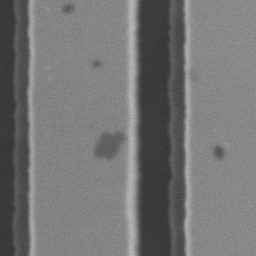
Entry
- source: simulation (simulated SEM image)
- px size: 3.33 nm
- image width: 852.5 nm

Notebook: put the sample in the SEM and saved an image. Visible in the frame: lines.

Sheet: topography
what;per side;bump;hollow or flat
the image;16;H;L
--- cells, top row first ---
LLHHHHHHHLLLHHHH
LLHHHHHHHLLLHHHH
LLHHHHHHHLLLHHHH
LLHHHHHHHLLLHHHH
LLHHHHHHHLLLHHHH
LLHHHHHHHLLLHHHH
LLHHHHHHHLLLHHHH
LLHHHHHHHLLLHHHH
LLHHHHHHHLLLHHHH
LLHHHHHHHLLLHHHH
LLHHHHHHHLLLHHHH
LLHHHHHHHLLLHHHH
LLHHHHHHHLLLHHHH
LLHHHHHHHLLLHHHH
LLHHHHHHHLLLHHHH
LLHHHHHHHLLLHHHH